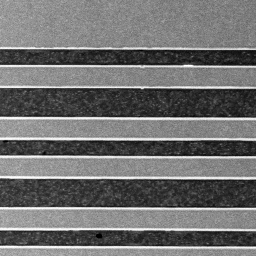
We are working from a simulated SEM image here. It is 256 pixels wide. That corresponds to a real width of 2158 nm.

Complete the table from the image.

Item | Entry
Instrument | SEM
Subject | parallel lines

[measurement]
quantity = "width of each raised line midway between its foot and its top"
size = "180 nm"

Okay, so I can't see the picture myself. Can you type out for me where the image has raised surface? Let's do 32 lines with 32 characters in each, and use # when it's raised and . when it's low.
################################
################################
################################
################################
################################
################################
................................
................................
################################
################################
################################
................................
................................
................................
................................
################################
################################
.....#..........................
................................
................................
################################
################################
................................
................................
................................
................................
################################
################################
################################
................................
................................
################################